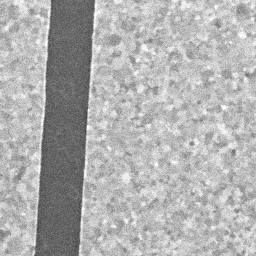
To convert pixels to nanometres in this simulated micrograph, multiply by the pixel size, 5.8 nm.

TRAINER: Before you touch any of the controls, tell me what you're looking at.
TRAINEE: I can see one or a few lines or trenches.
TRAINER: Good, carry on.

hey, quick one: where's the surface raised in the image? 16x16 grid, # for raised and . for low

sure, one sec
###...##########
###...##########
###...##########
###...##########
###...##########
###...##########
###...##########
###...##########
###..###########
###..###########
##...###########
##...###########
##...###########
##...###########
##...###########
##...###########